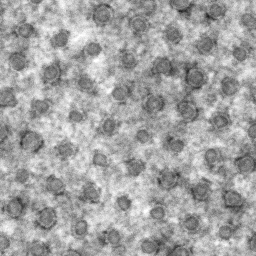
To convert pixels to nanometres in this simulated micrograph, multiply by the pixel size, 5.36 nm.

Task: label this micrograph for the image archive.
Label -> a regular array of raised bodies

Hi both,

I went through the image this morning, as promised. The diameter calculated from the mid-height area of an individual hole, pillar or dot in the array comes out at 86.1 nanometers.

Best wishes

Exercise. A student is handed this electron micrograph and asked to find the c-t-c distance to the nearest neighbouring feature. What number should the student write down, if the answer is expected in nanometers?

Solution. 184